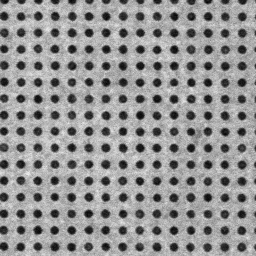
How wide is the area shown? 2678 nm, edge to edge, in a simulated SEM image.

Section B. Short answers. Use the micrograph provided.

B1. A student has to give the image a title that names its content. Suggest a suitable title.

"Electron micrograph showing a regular array of holes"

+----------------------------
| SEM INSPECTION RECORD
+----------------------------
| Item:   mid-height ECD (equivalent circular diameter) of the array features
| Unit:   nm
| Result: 100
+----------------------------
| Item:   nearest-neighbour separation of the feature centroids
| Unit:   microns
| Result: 0.171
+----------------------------